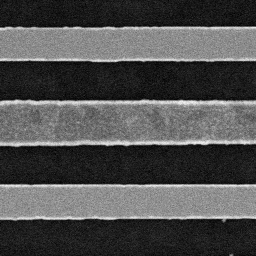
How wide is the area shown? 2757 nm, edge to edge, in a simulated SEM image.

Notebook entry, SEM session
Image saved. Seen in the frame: lines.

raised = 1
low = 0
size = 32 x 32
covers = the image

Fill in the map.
00000000000000000000000000000000
00000000000000000000000000000000
00000000000000000000000000000000
01100000111001111111111111111111
11111111111111111111111111111111
11111111111111111111111111111111
11111111111111111111111111111111
11111111111111111111111111111111
00000000000000000000000000000000
00000000000000000000000000000000
00000000000000000000000000000000
00000000000000000000000000000000
00000000000000000000000000000000
11111111111111111111111111111111
11111111111111111111111111111111
11111111111111111111111111111111
11111111111111111111111111111111
11111111111111111111111111111111
00000000000000000000000000000000
00000000000000000000000000000000
00000000000000000000000000000000
00000000000000000000000000000000
00000000000000000000000000000000
11111111111111111111111111111111
11111111111111111111111111111111
11111111111111111111111111111111
11111111111111111111111111111111
00000000000000000000000000000000
00000000000000000000000000000000
00000000000000000000000000000000
00000000000000000000000000000000
00000000000000000000000000000000